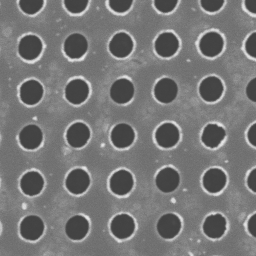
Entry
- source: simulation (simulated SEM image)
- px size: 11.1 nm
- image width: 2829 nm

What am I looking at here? a regular array of holes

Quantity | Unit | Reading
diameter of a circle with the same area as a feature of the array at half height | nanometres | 274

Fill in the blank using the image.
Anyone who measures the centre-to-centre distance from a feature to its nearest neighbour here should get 0.492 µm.